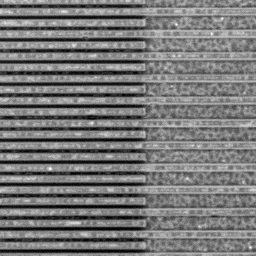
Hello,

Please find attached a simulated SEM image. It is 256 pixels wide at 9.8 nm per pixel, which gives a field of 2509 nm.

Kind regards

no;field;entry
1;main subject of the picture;parallel lines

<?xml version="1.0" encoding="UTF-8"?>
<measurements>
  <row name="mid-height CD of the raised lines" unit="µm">0.0686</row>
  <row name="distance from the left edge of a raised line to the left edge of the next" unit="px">11.1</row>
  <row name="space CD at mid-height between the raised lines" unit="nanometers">44.1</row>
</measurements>